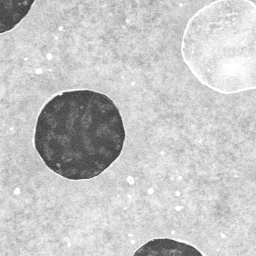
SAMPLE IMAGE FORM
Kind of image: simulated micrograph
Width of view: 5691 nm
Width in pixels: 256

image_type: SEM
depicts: holes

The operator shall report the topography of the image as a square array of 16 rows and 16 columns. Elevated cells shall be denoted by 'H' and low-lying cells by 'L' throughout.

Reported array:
LLHHHHHHHHHHHHHH
LHHHHHHHHHHHHHHH
HHHHHHHHHHHHHHHH
HHHHHHHHHHHHHHHH
HHHHHHHHHHHHHHHH
HHHHHHHHHHHHHHHH
HHHLLLLHHHHHHHHH
HHLLLLLLHHHHHHHH
HHLLLLLLHHHHHHHH
HHLLLLLLHHHHHHHH
HHHLLLLHHHHHHHHH
HHHHHHHHHHHHHHHH
HHHHHHHHHHHHHHHH
HHHHHHHHHHHHHHHH
HHHHHHHHHHHHHHHH
HHHHHHHHHLLLHHHH